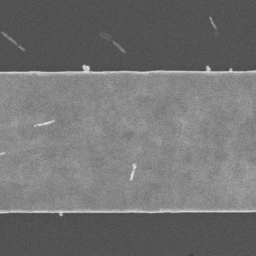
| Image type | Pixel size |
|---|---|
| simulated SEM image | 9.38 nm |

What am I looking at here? wiring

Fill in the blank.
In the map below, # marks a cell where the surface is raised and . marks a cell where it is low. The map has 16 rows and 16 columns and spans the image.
................
................
................
................
.##.############
################
################
################
################
################
################
################
################
................
................
................